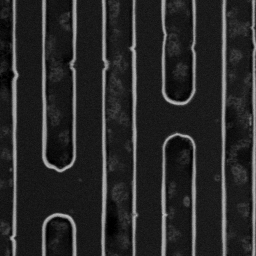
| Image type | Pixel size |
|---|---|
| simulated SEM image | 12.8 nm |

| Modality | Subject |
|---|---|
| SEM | parallel lines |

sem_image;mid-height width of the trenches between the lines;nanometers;383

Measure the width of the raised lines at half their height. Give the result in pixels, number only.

30.1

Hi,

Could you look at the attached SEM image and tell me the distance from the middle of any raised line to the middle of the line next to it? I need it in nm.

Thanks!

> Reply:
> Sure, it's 767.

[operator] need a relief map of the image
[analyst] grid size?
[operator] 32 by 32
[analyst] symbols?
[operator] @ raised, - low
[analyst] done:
--@@@----@@@@----@@@----@@@@----
--@@@----@@@@----@@@----@@@@----
--@@@----@@@@----@@@----@@@@----
--@@@----@@@@----@@@@---@@@@----
--@@@----@@@@----@@@@---@@@@----
--@@@----@@@@----@@@@---@@@@----
--@@@----@@@@----@@@@---@@@@----
--@@@----@@@@----@@@----@@@@----
--@@@----@@@@----@@@----@@@@----
--@@@----@@@@----@@@@---@@@@----
--@@@----@@@@----@@@----@@@@----
--@@@----@@@@----@@@@---@@@@----
--@@@----@@@@----@@@@--@@@@@----
--@@@@---@@@@----@@@@@@@@@@@----
--@@@@---@@@@----@@@@@@@@@@@----
--@@@@---@@@@----@@@@@@@@@@@----
--@@@@---@@@@----@@@@@@@@@@@----
--@@@@---@@@@----@@@@---@@@@----
--@@@@---@@@@----@@@@---@@@@----
--@@@@---@@@@----@@@@---@@@@----
--@@@@---@@@@----@@@@---@@@@----
--@@@@@@@@@@@----@@@@---@@@@----
--@@@@@@@@@@@----@@@@---@@@@----
--@@@@@@@@@@@----@@@@---@@@@----
--@@@@@@@@@@@----@@@@---@@@@----
--@@@@@@@@@@@----@@@@---@@@@----
--@@@@@@@@@@@----@@@@---@@@@----
--@@@@---@@@@----@@@@---@@@@----
--@@@@---@@@@----@@@----@@@@----
--@@@----@@@@----@@@----@@@@----
--@@@----@@@@----@@@----@@@@----
--@@@----@@@@----@@@----@@@@----